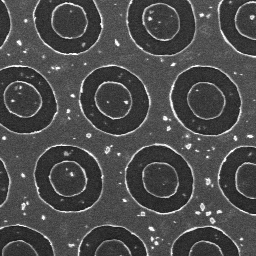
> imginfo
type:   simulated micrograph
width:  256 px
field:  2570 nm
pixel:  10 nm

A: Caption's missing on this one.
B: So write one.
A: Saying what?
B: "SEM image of ring-shaped grooves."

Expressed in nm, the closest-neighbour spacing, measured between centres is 907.